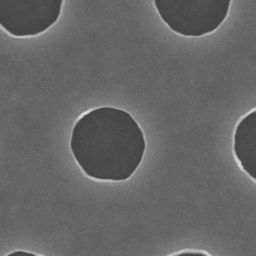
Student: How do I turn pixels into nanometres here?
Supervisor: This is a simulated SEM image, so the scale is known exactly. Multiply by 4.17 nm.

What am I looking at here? holes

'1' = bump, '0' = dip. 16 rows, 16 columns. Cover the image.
0000111111000011
0001111111000011
1111111111111111
1111111111111111
1111111111111111
1111111111111111
1111111111111111
1111100011111110
1111000001111110
1111100001111110
1111100011111110
1111111111111111
1111111111111111
1111111111111111
1111111111111111
1111111111111111